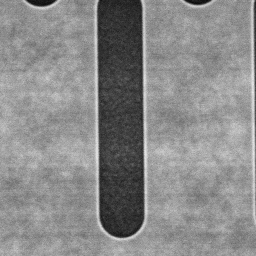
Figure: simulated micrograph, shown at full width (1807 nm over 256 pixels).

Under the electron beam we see groups of lines, slits or small figures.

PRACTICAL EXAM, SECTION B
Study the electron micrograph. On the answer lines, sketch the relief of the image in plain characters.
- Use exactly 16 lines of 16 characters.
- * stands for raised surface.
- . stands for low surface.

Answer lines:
******...*******
******...*******
******...*******
******...*******
******...*******
******...*******
******...*******
******...*******
******...*******
******...*******
******...*******
******...*******
******...*******
******...*******
*******..*******
****************